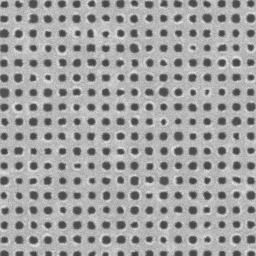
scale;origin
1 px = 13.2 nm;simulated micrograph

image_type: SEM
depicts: a regular array of holes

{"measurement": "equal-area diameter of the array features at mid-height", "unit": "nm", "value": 110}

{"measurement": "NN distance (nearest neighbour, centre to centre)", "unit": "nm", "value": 186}